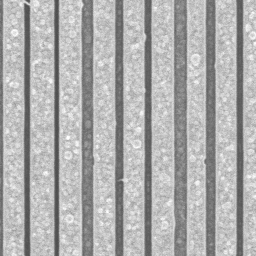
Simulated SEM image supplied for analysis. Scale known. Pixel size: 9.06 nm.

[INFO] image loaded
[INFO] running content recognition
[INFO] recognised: parallel lines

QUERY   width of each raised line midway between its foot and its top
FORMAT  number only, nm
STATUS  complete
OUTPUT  192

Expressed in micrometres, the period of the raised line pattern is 0.275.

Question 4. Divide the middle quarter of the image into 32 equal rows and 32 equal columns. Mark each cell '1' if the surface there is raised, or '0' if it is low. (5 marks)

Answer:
11110001111110011111001111100001
11110001111110011111001111100001
11110001111110011111001111100001
11110001111110011111001111100001
11110001111110011111001111100001
11110001111110011111001111100001
11110001111110011111001111100001
11110001111110011111001111100001
11110001111110011111001111100001
11110001111110011111001111100001
11110001111110011111001111100001
11110001111110011111001111100001
11110001111110011111001111100001
11110001111110011111001111100001
11110001111110011111001111100001
11110001111110011111001111100001
11110001111110011111001111100001
11110001111110011111001111100001
11110001111110011111001111100001
11110001111110011111001111100001
11110001111110011111001111100001
11110001111110011111001111100001
11110001111110011111001111100001
11110001111110011111001111100001
11110000111110011111001111100001
11110001111110011111001111100001
11110001111110011111001111100001
11110001111110011111001111100001
11110001111110011111001111100001
11110001111110011111001111100001
11110001111110011111001111100001
11110001111110011111001111100001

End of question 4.